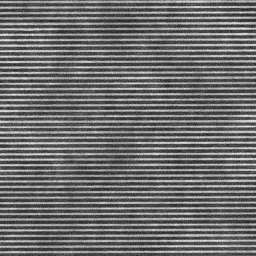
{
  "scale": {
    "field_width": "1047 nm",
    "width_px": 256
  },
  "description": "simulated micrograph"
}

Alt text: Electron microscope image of parallel lines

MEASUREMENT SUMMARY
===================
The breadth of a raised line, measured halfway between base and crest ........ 8.7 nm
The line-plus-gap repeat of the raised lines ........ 0.0223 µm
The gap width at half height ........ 14.8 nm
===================